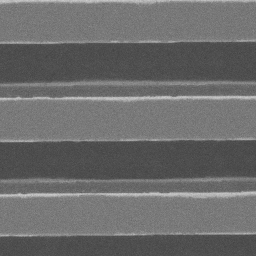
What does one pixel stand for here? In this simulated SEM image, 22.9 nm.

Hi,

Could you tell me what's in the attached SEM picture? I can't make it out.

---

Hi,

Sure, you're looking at lines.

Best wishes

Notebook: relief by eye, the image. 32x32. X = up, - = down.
XXXXXXXXXXXXXXXXXXXXXXXXXXXXXXXX
XXXXXXXXXXXXXXXXXXXXXXXXXXXXXXXX
XXXXXXXXXXXXXXXXXXXXXXXXXXXXXXXX
XXXXXXXXXXXXXXXXXXXXXXXXXXXXXXXX
XXXXXXXXXXXXXXXXXXXXXXXXXXXXXXXX
--------------------------------
--------------------------------
--------------------------------
--------------------------------
--------------------------------
----------------------XX-XXXXXXX
XXXXXXXXXXXXXXXXXXXXXXXXXXXXXXXX
XXXXXXXXXXXXXXXXXXXXXXXXXXXXXXXX
XXXXXXXXXXXXXXXXXXXXXXXXXXXXXXXX
XXXXXXXXXXXXXXXXXXXXXXXXXXXXXXXX
XXXXXXXXXXXXXXXXXXXXXXXXXXXXXXXX
XXXXXXXXXXXXXXXXXXXXXXXXXXXXXXXX
XXXXXXXXXXXXXXXXXXXX-X----------
--------------------------------
--------------------------------
--------------------------------
--------------------------------
--------------------------------
XXXXXXXXXXXXXXXXXXXXXXXXXXXXXXXX
XXXXXXXXXXXXXXXXXXXXXXXXXXXXXXXX
XXXXXXXXXXXXXXXXXXXXXXXXXXXXXXXX
XXXXXXXXXXXXXXXXXXXXXXXXXXXXXXXX
XXXXXXXXXXXXXXXXXXXXXXXXXXXXXXXX
XXXXXXXXXXXXXXXXXXXXXXXXXXXXXXXX
--------------------------------
--------------------------------
--------------------------------